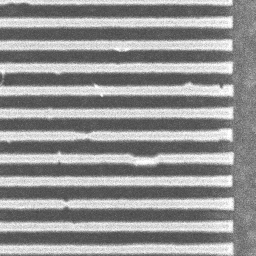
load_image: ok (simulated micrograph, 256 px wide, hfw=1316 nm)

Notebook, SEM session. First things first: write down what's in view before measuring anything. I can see parallel lines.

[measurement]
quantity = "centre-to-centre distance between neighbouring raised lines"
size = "0.116 um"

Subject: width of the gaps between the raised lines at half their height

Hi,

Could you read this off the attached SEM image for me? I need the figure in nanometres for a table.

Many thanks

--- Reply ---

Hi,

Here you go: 64.9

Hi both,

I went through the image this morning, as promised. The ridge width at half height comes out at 52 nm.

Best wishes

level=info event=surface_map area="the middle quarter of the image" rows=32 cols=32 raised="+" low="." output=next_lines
++++++++++++++++++++++++++++++++
++++++++++++++++++++++++++++++++
................................
................................
................................
...+.+++++..........++.....+++++
++++++++++++++++++++++++++++++++
++++++++++++++++++++++++++++++++
................................
................................
................................
++++++++++++++++++++++++++++++++
++++++++++++++++++++++++++++++++
+..+++++++++++++++++.++++++..+++
................................
................................
................................
++++++++++++++++++++++++++++++++
++++++++++++++++++++++++++++++++
................................
................................
................................
++++++....+++..++.........+++..+
++++++++++++++++++++++++++++++++
++++++++++++++++++++++++++++++++
................................
................................
................................
++++++++++++++++++++++++++++++++
++++++++++++++++++++++++++++++++
+....++.....................++.+
................................